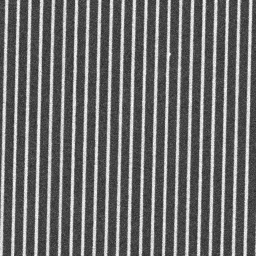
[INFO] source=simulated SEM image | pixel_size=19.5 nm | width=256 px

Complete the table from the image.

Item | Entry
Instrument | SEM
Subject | parallel lines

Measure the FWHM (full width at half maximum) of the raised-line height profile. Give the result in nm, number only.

36.6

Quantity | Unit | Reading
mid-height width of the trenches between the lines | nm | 183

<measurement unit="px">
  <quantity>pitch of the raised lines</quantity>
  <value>11.6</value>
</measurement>